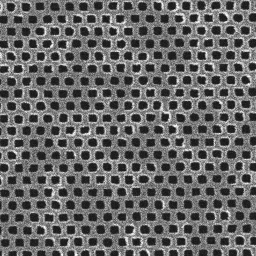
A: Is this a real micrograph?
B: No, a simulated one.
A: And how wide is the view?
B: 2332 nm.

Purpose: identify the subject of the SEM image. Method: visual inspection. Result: a regular array of holes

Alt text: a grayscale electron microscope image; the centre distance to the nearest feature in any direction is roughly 126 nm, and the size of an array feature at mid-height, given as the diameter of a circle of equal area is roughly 84.1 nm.